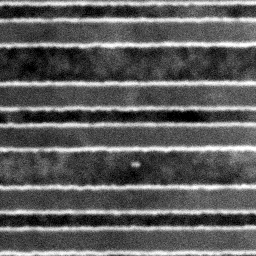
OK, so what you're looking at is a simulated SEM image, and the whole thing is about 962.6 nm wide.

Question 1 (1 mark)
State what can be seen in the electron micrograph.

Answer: lines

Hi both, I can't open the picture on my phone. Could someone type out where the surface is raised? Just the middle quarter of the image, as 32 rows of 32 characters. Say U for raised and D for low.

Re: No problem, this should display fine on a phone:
DDDDDDDDDDDDDDDDDDDDDDDDDDDDDDDD
DDDDDDDDDDDDDDDDDDDDDDDDDDDDDDDD
DDDDDDDDDDDDDDDDDDDDDDDDDDDDDDDD
DDDDDDDDDDDDDDDDDDDDDDDDDDDDDDDD
DDDDDDDDDDDDDDDDDDDDDDDDDDDDDDDD
UUUUUUUUUUUUUUUUUUUUUUUUUUUUUUUU
UUUUUUUUUUUUUUUUUUUUUUUUUUUUUUUU
UUUUUUUUUUUUUUUUUUUUUUUUUUUUUUUU
UUUUUUUUUUUUUUUUUUUUUUUUUUUUUUUU
UUUUUUUUUUUUUUUUUUUUUUUUUUUUUUUU
UUUUUUUUUUUUUUUUUUUUUUUUUUUUUUUU
DDDDDDDDDDDDDDUDDUDDDDDDDDDDDUDD
DDDDDDDDDDDDDDDDDDDDDDDDDDDDDDDD
DDDDDDDDDDDDDDDDDDDDDDDDDDDDDDDD
DDDDDDDDDDDDDDDDDDDDDDDDDDDDDDDD
UUUUUUUUUUUUUUUUUUUUUUUUUUUUUUUU
UUUUUUUUUUUUUUUUUUUUUUUUUUUUUUUU
UUUUUUUUUUUUUUUUUUUUUUUUUUUUUUUU
UUUUUUUUUUUUUUUUUUUUUUUUUUUUUUUU
UUUUUUUUUUUUUUUUUUUUUUUUUUUUUUUU
UUUUUUUUUUUUUUUUUUUUUUUUUUUUUUUU
UUUUUDDUDDDUDDDDDDDDUDDDDUDDDDDD
DDDDDDDDDDDDDDDDDDDDDDDDDDDDDDDD
DDDDDDDDDDDDDDDDDDDDDDDDDDDDDDDD
DDDDDDDDDDDDDDDDDDDDDDDDDDDDDDDD
DDDDDDDDDDDDDDDDDDDDDDDDDDDDDDDD
DDDDDDDDDDDDDDDDDDDDDDDDDDDDDDDD
DDDDDDDDDDDDDDDDDDDDDDDDDDDDDDDD
DDDDDDDDDDDDDDDDDDDDDDDDDDDDDDDD
DDDDDDDDDDDDDDDDDDDDDDDDDDDDDDDD
DDDDDDDDDDDDDDDDDDDDDDDDDDDDDDDD
UUUUUUUUUUUUUUUUUUUUUUUUUUUUUUUU